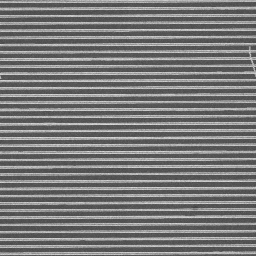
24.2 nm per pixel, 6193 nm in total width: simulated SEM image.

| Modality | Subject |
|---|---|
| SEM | parallel lines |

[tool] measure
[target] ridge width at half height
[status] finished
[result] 0.0454 µm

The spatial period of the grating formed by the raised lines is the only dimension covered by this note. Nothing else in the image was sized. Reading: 0.174 um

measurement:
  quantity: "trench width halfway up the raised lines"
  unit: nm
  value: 121